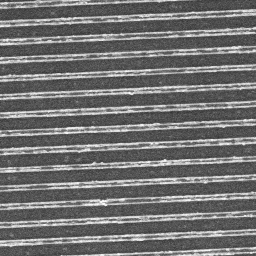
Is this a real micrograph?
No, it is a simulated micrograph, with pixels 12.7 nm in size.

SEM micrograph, parallel lines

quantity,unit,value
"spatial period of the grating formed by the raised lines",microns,0.232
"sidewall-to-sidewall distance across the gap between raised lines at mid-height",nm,169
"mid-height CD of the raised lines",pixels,5.62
